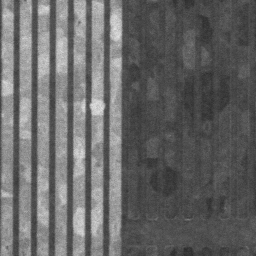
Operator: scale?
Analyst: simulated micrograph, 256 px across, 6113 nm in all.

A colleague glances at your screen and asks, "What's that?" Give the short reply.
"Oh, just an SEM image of parallel lines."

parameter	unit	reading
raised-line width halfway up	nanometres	260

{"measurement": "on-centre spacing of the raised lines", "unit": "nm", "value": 434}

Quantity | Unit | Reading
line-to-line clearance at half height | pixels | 7.25